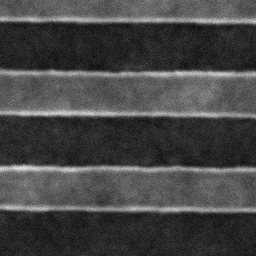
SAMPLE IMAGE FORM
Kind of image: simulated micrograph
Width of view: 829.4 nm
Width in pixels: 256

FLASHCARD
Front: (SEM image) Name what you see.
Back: lines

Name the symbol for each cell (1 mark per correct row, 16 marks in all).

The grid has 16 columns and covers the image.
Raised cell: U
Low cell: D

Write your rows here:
UUUUUUUUUUUUUUUU
DDDDDDDDDDDDDDDD
DDDDDDDDDDDDDDDD
DDDDDDDDDDDDDDDD
UUUUUUDDDDDDUDDD
UUUUUUUUUUUUUUUU
UUUUUUUUUUUUUUUU
DDDDDDDDDDDDDDDD
DDDDDDDDDDDDDDDD
DDDDDDDDDDDDDDDD
UUUUUUUUUUUUUDDD
UUUUUUUUUUUUUUUU
UUUUUUUUUUUUUUUU
DDDDDDDDDDDDDDDD
DDDDDDDDDDDDDDDD
DDDDDDDDDDDDDDDD